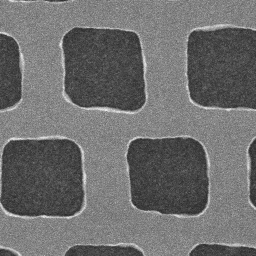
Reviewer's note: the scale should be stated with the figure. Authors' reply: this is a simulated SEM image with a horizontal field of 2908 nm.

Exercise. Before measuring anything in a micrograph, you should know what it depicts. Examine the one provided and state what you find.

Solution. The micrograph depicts holes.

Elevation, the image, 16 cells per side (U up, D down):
UUUUUUUUUUUUUUUU
UUUUUUUUUUUUUUUU
DUUUDDDDDUUUDDDD
DUUUDDDDDUUUDDDD
DUUUDDDDDUUUDDDD
DUUUDDDDDUUUDDDD
DUUUUDDDDUUUDDDD
UUUUUUUUUUUUUUUU
UUUUUUUUUUUUUUUU
DDDDDUUUDDDDDUUU
DDDDDUUUDDDDDUUU
DDDDDUUUDDDDDUUU
DDDDDUUUDDDDDUUU
UDDDUUUUUUUUUUUU
UUUUUUUUUUUUUUUU
UUUUDDDDDUUUDDDD